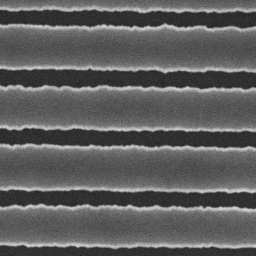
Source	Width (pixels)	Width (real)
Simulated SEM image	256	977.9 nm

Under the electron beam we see lines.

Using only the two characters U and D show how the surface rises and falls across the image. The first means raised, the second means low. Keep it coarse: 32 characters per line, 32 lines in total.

UUUUUUUUUUUUUUUUUUUUUUUUUUUUUUUU
DDDDDDDDDDDDDDDDDUDDDDUDDDDUDDDD
DDDDDDDDDDDDDDDDDDDDDDDDDDDDDDDD
UUUUUUUUUUUUUUUUUUUUUUUUUUDDUUDU
UUUUUUUUUUUUUUUUUUUUUUUUUUUUUUUU
UUUUUUUUUUUUUUUUUUUUUUUUUUUUUUUU
UUUUUUUUUUUUUUUUUUUUUUUUUUUUUUUU
UUUUUUUUUUUUUUUUUUUUUUUUUUUUUUUU
UUUUUUDUUUUUUUUUUUUUUUUUUUUUUUUU
DDDDDDDDDDDDDDDDDDDDDDDDDDDDDDDD
DDDDDDDDDDDDDDDDDDDDDDDDDDDDDDDD
UUUUUUUUUUUUUUUUUUUUUUUUUUUUUUUU
UUUUUUUUUUUUUUUUUUUUUUUUUUUUUUUU
UUUUUUUUUUUUUUUUUUUUUUUUUUUUUUUU
UUUUUUUUUUUUUUUUUUUUUUUUUUUUUUUU
UUUUUUUUUUUUUUUUUUUUUUUUUUUUUUUU
DDDDDDDDDDDDDDDDDDDDDDDDDDDDDDDD
DDDDDDDDDDDDDDDDDDDDDDDDDDDDDDDD
UUUUUUUUUUUUUUUUUUUUUUUUDUUDDDDU
UUUUUUUUUUUUUUUUUUUUUUUUUUUUUUUU
UUUUUUUUUUUUUUUUUUUUUUUUUUUUUUUU
UUUUUUUUUUUUUUUUUUUUUUUUUUUUUUUU
UUUUUUUUUUUUUUUUUUUUUUUUUUUUUUUU
UUUUUUUUUUUUUUUUUUUUUUUUUUUUUUUU
DDDDDDDDDDDDDDDDDDDDDDDDDDDDDDDD
DDDDDDDDDDDDDDDDDDDDDDDDDDDDDDDD
UUUUUUUUUUUUUUUUUUUUUUUUUUUUUUUU
UUUUUUUUUUUUUUUUUUUUUUUUUUUUUUUU
UUUUUUUUUUUUUUUUUUUUUUUUUUUUUUUU
UUUUUUUUUUUUUUUUUUUUUUUUUUUUUUUU
UUUUUUUUUUUUUUUUUUUUUUUUUUUUUUUU
DDDDDDDDDDDDDDDDDDDDDDDDDDDDDDDD